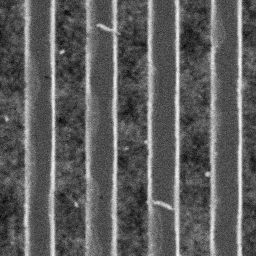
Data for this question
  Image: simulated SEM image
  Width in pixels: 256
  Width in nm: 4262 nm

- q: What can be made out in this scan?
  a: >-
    lines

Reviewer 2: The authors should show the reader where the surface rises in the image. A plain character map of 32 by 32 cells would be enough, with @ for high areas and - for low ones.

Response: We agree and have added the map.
----@@@----@@@-----@@@-----@@@--
----@@-----@@@-----@@@-----@@@--
----@@-----@@@-----@@@-----@@@--
---@@@-----@@@-----@@@-----@@@--
---@@@-----@@@@----@@@-----@@@--
---@@@-----@@@-----@@@-----@@@--
---@@@-----@@@-----@@@-----@@@--
----@@-----@@@-----@@@-----@@@--
----@@@----@@@-----@@@-----@@@--
----@@@----@@@-----@@@-----@@@--
----@@@----@@@-----@@@-----@@@--
----@@@----@@@-----@@@-----@@@--
----@@@----@@@-----@@@-----@@@--
----@@@----@@@-----@@@-----@@@--
----@@@----@@@-----@@@-----@@@--
----@@@----@@@-----@@@-----@@@--
----@@@----@@@-----@@@-----@@@--
----@@@----@@@-----@@@-----@@@--
----@@@----@@@-----@@@-----@@@--
----@@@----@@@-----@@@-----@@@--
----@@@----@@@-----@@@-----@@@--
----@@@----@@@-----@@@-----@@@--
----@@-----@@@-----@@@-----@@@--
----@@-----@@@-----@@@-----@@@--
---@@@-----@@@-----@@@-----@@@--
---@@@-----@@@-----@@@-----@@@--
---@@@-----@@@-----@@@-----@@@--
---@@@-----@@@-----@@@-----@@@--
---@@@-----@@@-----@@@-----@@@--
---@@@-----@@@-----@@@-----@@@--
----@@-----@@@-----@@@-----@@@--
----@@-----@@@-----@@@-----@@@--